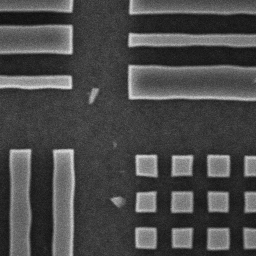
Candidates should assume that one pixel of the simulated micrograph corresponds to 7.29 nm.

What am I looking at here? groups of lines, slits or small figures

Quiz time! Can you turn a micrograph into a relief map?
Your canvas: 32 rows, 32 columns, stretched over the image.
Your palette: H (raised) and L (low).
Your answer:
HHHHHHHHHLLLLLLLHHHHHHHHHHHHHHHH
LLLLLLLLLLLLLLLLLHHHHHHHHHHHHHHH
LLLLLLLLLLLLLLLLLLLLLLLLLLLLLLLL
HHHHHHHHHLLLLLLLLLLLLLLLLLLLLLLL
HHHHHHHHHLLLLLLLHHHHHHHHHHHHHHHH
HHHHHHHHHLLLLLLLHHHHHHHHHHHHHHHH
HHHHHHHHHLLLLLLLLLLLLLLLLLLLLLLL
LLLLLLLLLLLLLLLLLLLLLLLLLLLLLLLL
LLLLLLLLLLLLLLLLHHHHHHHHHHHHHHHL
LLLLLLLLLLLLLLLLHHHHHHHHHHHHHHHH
HHHHHHHHHLLLLLLLHHHHHHHHHHHHHHHH
LLLLLLLLLLLLLLLLHHHHHHHHHHHHHHHH
LLLLLLLLLLLLLLLLLLLLLLLLLLLLLLLL
LLLLLLLLLLLLLLLLLLLLLLLLLLLLLLLL
LLLLLLLLLLLLLLLLLLLLLLLLLLLLLLLL
LLLLLLLLLLLLLLLLLLLLLLLLLLLLLLLL
LLLLLLLLLLLLLLLLLLLLLLLLLLLLLLLL
LLLLLLLLLLLLLLLLLLLLLLLLLLLLLLLL
LLLLLLLLLLLLLLLLLLLLLLLLLLLLLLLL
LHHHLLLHHLLLLLLLLLLLLLLLLLLLLLLL
LHHHLLLHHLLLLLLLLHHLLLHHLLHHHLLH
LHHHLLLHHLLLLLLLLHHLLLHHLLHHHLLH
LHHHLLLHHLLLLLLLLLLLLLLLLLLLLLLL
LHHHLLLHHLLLLLLLLLLLLLLLLLLLLLLL
LHHHLLLHHLLLLLLLLHHLLLHHLLHHLLLH
LHHHLLLHHLLLLLLLLHHLLLHHLLHHLLLH
LHHHLLLHHLLLLLLLLLLLLLLLLLLLLLLL
LHHHLLLHHLLLLLLLLLLLLLLLLLLLLLLL
LHHHLLLHHLLLLLLLLLLLLLLLLLLLLLLL
LHHHLLLHHLLLLLLLLHHLLLHHLLHHHLLH
LHHHLLLHHLLLLLLLLHHLLLHHLLHHHLLH
LHHHLLLHHLLLLLLLLLLLLLLLLLLLLLLL